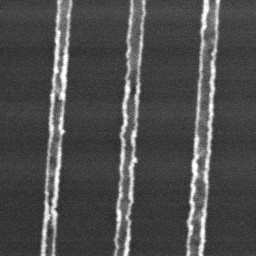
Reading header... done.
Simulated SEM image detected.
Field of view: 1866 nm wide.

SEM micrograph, one or a few lines or trenches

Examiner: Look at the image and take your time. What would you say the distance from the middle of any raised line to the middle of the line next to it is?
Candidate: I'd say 73.5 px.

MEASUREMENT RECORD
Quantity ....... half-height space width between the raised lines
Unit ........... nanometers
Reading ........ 443